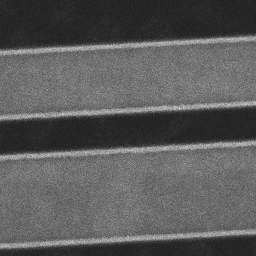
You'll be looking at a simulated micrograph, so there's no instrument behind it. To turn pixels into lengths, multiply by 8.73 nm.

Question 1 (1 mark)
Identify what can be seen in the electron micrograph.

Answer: one or a few lines or trenches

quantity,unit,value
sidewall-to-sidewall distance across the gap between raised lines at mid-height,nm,662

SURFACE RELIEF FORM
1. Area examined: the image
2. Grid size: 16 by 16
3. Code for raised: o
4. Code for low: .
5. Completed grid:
oooooooooooooooo
oooooooooooooooo
ooooooooooooooo.
................
................
................
...............o
oooooooooooooooo
oooooooooooooooo
ooooooo.........
................
................
................
................
...............o
oooooooooooooooo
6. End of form